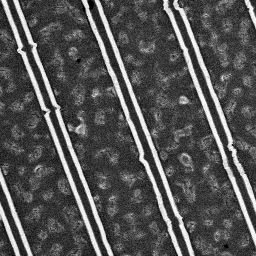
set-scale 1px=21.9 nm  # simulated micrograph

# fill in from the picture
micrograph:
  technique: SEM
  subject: one or a few lines or trenches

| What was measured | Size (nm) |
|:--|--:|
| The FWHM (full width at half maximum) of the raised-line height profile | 241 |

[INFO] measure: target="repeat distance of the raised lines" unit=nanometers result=1660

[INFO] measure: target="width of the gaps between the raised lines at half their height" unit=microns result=1.41